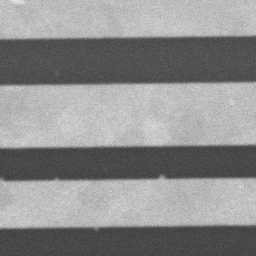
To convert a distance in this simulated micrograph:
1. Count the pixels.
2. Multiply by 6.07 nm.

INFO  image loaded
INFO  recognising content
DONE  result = groups of lines, slits or small figures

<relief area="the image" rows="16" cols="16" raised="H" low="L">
HHHHHHHHHHHHHHHH
HHHHHHHHHHHHHHHH
LLLLLLLLLLLLLLLL
LLLLLLLLLLLLLLLL
LLLLLLLLLLLLLLLL
HHHHHHHHHHHHHHHH
HHHHHHHHHHHHHHHH
HHHHHHHHHHHHHHHH
HHHHHHHHHHHHHHHH
LLLLLLLLLLLLLLLL
LLLLLLLLLLLLLLLL
HHHHHHHHHHHHHHHH
HHHHHHHHHHHHHHHH
HHHHHHHHHHHHHHHH
LLLLLLLLLLLLLLLL
LLLLLLLLLLLLLLLL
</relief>